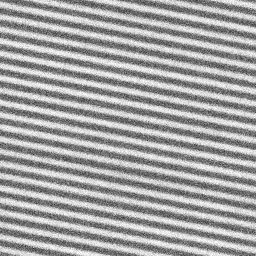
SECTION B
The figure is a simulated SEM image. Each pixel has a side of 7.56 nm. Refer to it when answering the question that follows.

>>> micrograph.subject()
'parallel lines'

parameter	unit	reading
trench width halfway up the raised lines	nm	63.1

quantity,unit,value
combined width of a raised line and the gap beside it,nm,90.7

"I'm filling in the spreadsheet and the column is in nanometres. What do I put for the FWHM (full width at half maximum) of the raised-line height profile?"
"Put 27.8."